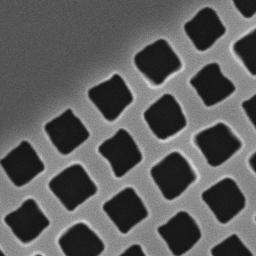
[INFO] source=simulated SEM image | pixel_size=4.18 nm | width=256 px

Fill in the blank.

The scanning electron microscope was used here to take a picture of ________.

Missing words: a regular array of holes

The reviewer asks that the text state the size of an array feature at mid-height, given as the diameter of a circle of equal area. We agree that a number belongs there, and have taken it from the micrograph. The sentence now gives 0.169 micrometres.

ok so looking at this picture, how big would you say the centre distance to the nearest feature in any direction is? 235 nm